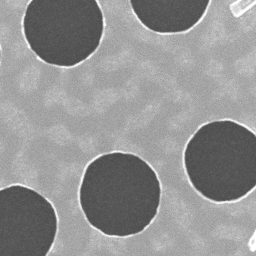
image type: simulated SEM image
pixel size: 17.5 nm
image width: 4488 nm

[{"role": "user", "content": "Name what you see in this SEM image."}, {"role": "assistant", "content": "holes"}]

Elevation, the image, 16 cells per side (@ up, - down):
@@----@@-----@@@
@-----@@@---@@@@
@@----@@@@@@@@@@
@@----@@@@@@@@@@
@@@@@@@@@@@@@@@@
@@@@@@@@@@@@@@@@
@@@@@@@@@@@@@@@@
@@@@@@@@@@@@@@@@
@@@@@@@@@@@@----
@@@@@@@@@@@@----
@@@@@----@@@----
@@@@@-----@@----
---@@-----@@@--@
----@-----@@@@@@
----@@---@@@@@@@
---@@@@@@@@@@@@@